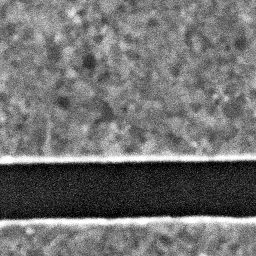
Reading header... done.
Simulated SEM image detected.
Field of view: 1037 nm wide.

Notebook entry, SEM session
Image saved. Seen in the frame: one or a few lines or trenches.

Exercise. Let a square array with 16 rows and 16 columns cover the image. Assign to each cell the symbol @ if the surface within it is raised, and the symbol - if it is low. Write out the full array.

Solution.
@@@@@@@@@@@@@@@@
@@@@@@@@@@@@@@@@
@@@@@@@@@@@@@@@@
@@@@@@@@@@@@@@@@
@@@@@@@@@@@@@@@@
@@@@@@@@@@@@@@@@
@@@@@@@@@@@@@@@@
@@@@@@@@@@@@@@@@
@@@@@@@@@@@@@@@@
@@@@@@@@@@@@@@@@
----------------
----------------
----------------
----------------
@@@@@@@@@@@@@@@@
@@@@@@@@@@@@@@@@